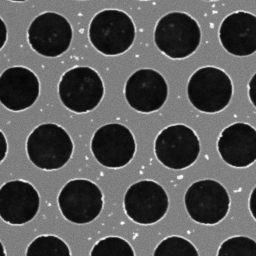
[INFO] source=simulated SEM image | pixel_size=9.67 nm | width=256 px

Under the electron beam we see a regular array of holes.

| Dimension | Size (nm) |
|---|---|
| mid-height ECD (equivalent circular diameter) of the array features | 426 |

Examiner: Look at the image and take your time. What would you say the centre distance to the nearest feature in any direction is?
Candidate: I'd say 0.607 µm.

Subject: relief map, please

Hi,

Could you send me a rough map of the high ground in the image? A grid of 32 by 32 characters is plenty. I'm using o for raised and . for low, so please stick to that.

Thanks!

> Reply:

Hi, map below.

oooooooooooooooooooooooooooooooo
ooooooooooooo..ooooooooooooooooo
oooo....oooo....oooo....oooo....
.ooo.....oo......ooo.....ooo....
.ooo.....oo......oo......oo.....
oooo.....ooo....oooo.....ooo....
ooooo...ooooo..ooooo....ooooo...
oooooooooooooooooooooooooooooooo
oo.ooooooo.oooooooooooooo.oooooo
....oooo....oooo....oooo....oooo
.....ooo.....ooo.....ooo.....oo.
.....oo......ooo.....oo......oo.
....oooo.....ooo.....ooo.....oo.
o..oooooo...ooooo...ooooo...oooo
oooooooooooooooooooooooooooooooo
oooooooooooooo.ooooooooooooooo.o
oooo....oooo....oooo....oooo....
.ooo.....ooo.....ooo.....oo.....
.oo......oo......oo......oo.....
.ooo.....ooo.....ooo.....ooo....
oooo....ooooo...oooo....ooooo..o
oooooooooooooooooooooooooooooooo
ooooooooo.oooooooooooooooooooooo
....oooo....oooo....oooo....oooo
.....oo......ooo.....oo......oo.
.....oo......ooo.....oo......oo.
.....ooo....oooo.....ooo....ooo.
o...ooooo...ooooo...oooo...ooooo
oooooooooooooooooooooooooooooooo
oooooooooooooooooooooooooooooooo
oooo....oooo....oooo....oooo....
.oo......ooo.....oo......oo.....